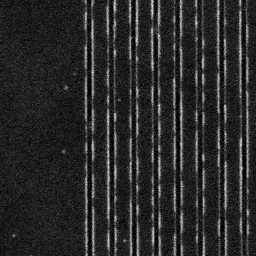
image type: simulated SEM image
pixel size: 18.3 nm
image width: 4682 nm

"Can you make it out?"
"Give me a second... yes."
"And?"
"parallel lines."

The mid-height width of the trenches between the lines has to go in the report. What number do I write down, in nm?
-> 96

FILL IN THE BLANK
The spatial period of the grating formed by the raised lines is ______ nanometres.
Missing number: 404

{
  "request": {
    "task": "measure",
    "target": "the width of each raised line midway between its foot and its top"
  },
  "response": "0.306 microns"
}